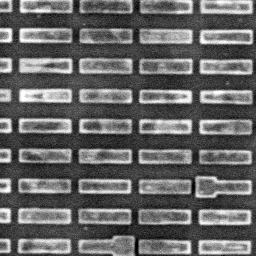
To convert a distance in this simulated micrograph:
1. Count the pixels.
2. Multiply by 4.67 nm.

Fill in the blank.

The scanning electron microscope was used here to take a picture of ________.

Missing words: wiring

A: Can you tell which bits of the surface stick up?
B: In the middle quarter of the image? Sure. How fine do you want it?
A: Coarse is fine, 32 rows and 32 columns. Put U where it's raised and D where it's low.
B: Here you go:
UUDDUUUUUUUUUUUUUDDUUUUUUUUUUUUU
UUDDUUUUUUUUUUUUUDDUUUUUUUUUUUUU
DDDDDDDDDDDDDDDDDDDDDDDDDDDDDDDD
DDDDDDDDDDDDDDDDDDDDDDDDDDDDDDDD
DDDDDDDDDDDDDDDDDDDDDDDDDDDDDDDD
DDDDDDDDDDDDDDDDDDDDDDDDDDDDDDDD
DDDDDDDDDDDDDDDDDDDDDDDDDDDDDDDD
UUDDUUUUUUUUUUUUUDDUUUUUUUUUUUUD
UUDDUUUUUUUUUUUUUDDUUUUUUUUUUUUD
DDDDDDDDDDDUUUUUDDDDDDDDDDDDDDDD
DDDDDDDDDDDDDDDDDDDDDDDDDDDDDDDD
DDDDDDDDDDDDDDDDDDDDDDDDDDDDDDDD
DDDDDDDDDDDDDDDDDDDDDDDDDDDDDDDD
DDDDDDDDDDDDDDDDDDDDDDDDDDDDDDDD
UDDDUUUUUUUUUUUUUDDUUUDDDDDDDDDD
UDDDUUUUUUUUUUUUUDDUUUUUUUUUUUUD
UDDDUUUUUUUUUUUUUDDUUUUUUUUUUUUD
DDDDDDDDDDDDDDDDDDDDDDDDDDDDDDDD
DDDDDDDDDDDDDDDDDDDDDDDDDDDDDDDD
DDDDDDDDDDDDDDDDDDDDDDDDDDDDDDDD
DDDDDDDDDDDDDDDDDDDDDDDDDDDDDDDD
DDDDDDDDDDDDDDDDDDDDDDDDDDDDDDDD
UUDDUUUUUUUUUUUUUDDUUUUUUUUUUUUU
UUDDUUUUUUUUUUUUUDDUUUUUUUUUUUUU
DDDDUUUUUUDDDDDUDDDUUUUUUUUUUUUU
DDDDDDDDDDDDDDDDDDDDDDDDDDDDDDDD
DDDDDDDDDDDDDDDDDDDDDDDDDDDDDDDD
DDDDDDDDDDDDDDDDDDDDDDDDDDDDDDDD
DDDDDDDDDDDDDDDDDDDDDDDDDDDDDDDD
UUDDUUUUUUUUUUUUDDDUUUUUUUUUUUUU
UUDDUUUUUUUUUUUUDDDUUUUUUUUUUUUU
UUDDUUUUUUUUUUUUDDDUUUUUUUUUUUUU